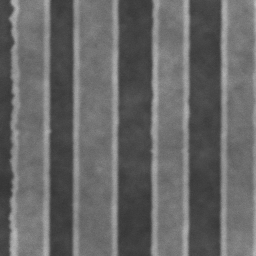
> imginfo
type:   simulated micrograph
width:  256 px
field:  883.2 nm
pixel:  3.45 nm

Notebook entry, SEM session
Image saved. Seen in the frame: one or a few lines or trenches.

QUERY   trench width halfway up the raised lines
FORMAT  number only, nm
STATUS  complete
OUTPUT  131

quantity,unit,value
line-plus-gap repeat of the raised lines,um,0.242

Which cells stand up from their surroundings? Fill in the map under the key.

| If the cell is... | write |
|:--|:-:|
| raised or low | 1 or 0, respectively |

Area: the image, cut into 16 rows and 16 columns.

0110011000110011
0110011000110011
0110011000110011
0110011000110011
0110011000110011
0110011000110011
0110011000110011
0110011000110011
0110011000110011
0110011000110011
0110011000110011
0110011000110011
0110011000110011
0110011000110011
0110011000110011
0110011000110011